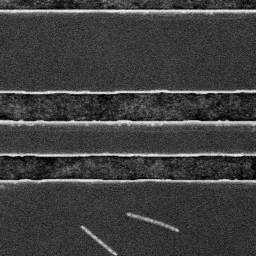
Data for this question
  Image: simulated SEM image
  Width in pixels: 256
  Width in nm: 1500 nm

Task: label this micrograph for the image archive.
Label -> lines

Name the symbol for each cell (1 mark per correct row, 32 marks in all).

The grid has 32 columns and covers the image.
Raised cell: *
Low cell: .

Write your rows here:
................................
********************************
********************************
********************************
********************************
********************************
********************************
********************************
********************************
********************************
********************************
*******************...*******...
................................
................................
................................
********************************
********************************
********************************
********************************
................................
................................
................................
...*.********....*****..........
********************************
********************************
********************************
********************************
********************************
********************************
********************************
********************************
********************************